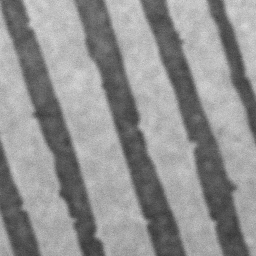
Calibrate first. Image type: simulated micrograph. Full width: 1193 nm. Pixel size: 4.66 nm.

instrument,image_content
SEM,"one or a few lines or trenches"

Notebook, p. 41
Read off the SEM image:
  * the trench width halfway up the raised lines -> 28.3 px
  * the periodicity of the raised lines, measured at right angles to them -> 0.311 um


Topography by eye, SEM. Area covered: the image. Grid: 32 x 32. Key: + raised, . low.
...++++++.....+++....+++++..++++
....+++++.....++++...+++++...+++
....++++++....++++....++++...+++
+...++++++....+++++...+++++..+++
+....+++++.....++++....++++...++
+....+++++.....++++....++++...++
++...++++++....+++++...+++++..++
++....+++++.....++++....++++...+
++....++++++....++++....++++...+
+++...++++++....+++++...+++++..+
+++....+++++....+++++....++++...
+++....++++++....+++++...++++...
++++....+++++....+++++...+++++..
++++....+++++....+++++....++++..
++++....++++++....++++....+++++.
+++++...++++++....+++++...+++++.
+++++....+++++....+++++....++++.
+++++....++++++...+++++....+++++
.+++++....+++++....+++++....++++
.+++++....+++++....+++++....++++
.++++++...++++++...+++++....++++
..+++++...++++++....++++....++++
..+++++....+++++....+++++....+++
..+++++....+++++.....++++.....++
...++++....++++++....++++....+++
...+++++....+++++....++++.....++
...+++++....+++++.....++++....++
....+++++...++++++....++++....++
....+++++...++++++....+++++...++
+....++++...++++++.....++++....+
+....+++++...++++++....++++....+
+....+++++...++++++....++++....+